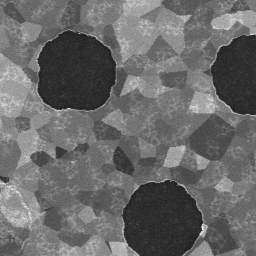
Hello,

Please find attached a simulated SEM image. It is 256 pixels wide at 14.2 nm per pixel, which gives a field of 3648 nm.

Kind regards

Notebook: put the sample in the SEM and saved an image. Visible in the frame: holes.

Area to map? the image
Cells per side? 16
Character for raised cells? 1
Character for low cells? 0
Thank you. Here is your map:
1111111111111111
1111111111111111
1110001111111110
1100000111111100
1100000111111000
1100000111111000
1110001111111100
1111111111111111
1111111111111111
1111111111111111
1111111111111111
1111111110011111
1111111100001111
1111111100000111
1111111100000111
1111111100001111